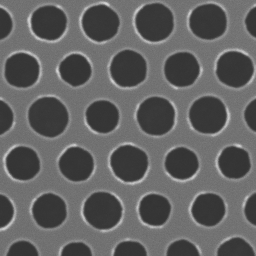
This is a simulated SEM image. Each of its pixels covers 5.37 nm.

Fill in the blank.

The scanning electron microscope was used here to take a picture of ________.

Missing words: a regular array of holes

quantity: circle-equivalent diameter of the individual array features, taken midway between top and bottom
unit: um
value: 0.191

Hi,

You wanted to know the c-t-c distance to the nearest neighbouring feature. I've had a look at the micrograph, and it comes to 284 nanometres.